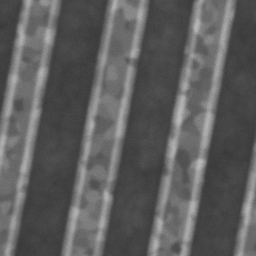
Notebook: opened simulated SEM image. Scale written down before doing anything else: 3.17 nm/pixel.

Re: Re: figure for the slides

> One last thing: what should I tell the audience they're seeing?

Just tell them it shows one or a few lines or trenches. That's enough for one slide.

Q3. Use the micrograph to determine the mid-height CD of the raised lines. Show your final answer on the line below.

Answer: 27.8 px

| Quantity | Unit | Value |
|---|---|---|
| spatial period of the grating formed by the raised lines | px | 85.4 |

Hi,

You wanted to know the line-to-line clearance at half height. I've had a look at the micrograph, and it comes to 180 nanometers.